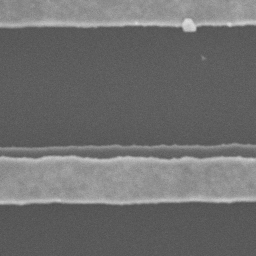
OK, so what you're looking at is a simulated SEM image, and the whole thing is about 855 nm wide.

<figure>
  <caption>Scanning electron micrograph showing lines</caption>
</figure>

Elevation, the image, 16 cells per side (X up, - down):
XXXXXXXXXXXXXXXX
XXXXXXXXXXXXXXXX
----------------
----------------
----------------
----------------
----------------
----------------
----------------
----------------
XXXXXXXXXXXXXXXX
XXXXXXXXXXXXXXXX
XXXXXXXXXXXXXXXX
----------------
----------------
----------------